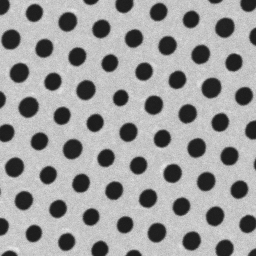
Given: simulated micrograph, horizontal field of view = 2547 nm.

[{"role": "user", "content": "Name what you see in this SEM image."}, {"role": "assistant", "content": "a regular array of holes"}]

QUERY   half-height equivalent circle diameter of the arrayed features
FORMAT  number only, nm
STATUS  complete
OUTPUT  186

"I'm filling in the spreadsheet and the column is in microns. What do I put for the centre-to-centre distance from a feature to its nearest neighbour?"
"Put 0.338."